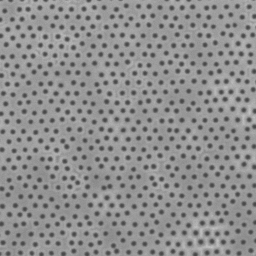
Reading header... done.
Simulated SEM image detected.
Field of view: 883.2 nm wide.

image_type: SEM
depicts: a regular array of holes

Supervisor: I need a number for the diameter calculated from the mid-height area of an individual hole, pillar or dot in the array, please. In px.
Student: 4.64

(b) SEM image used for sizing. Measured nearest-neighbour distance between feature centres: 9.25 px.